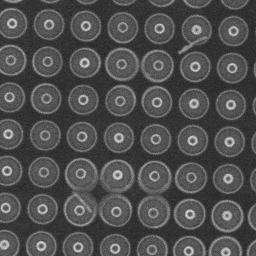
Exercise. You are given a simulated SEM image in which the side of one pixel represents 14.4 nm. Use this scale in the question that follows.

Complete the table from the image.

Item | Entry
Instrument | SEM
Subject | an array of small figures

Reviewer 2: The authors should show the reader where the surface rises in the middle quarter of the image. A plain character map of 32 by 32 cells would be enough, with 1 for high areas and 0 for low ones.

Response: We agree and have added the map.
11000100011001100001000110011000
11000000111000000011000000011000
11100001111100000011000000011100
11111111111110000111100000111110
11111111111111111111111111111111
11111111111111011111111111111111
11000001111100000111100001111110
11000000111000000111000000111100
10001100111001100011000000011000
10001100110001100011001100011000
11000000111000000011000000011000
11100001111100000111000000111000
11111111111110001111100001111100
11111111111111111111111111111111
11111111111111111111111111111111
11000001111100001111110011111111
10000000111000000111000000111100
10001000110001000111000000111000
10011000110001100110001100111001
10000000110000000110001100111001
11000001111000001111000000111000
11100111111100011111000001111000
11111111111111111111111111111110
11111111111111111111111111111111
11000011111100011111110011111111
10000001110000001111000001111100
10011000110000000110000000111000
00011000110001000110001100110001
10001000100001000110001100010001
10000000110000000110000000110000
11000001110000001110000000110000
11110111111100011111100001111100